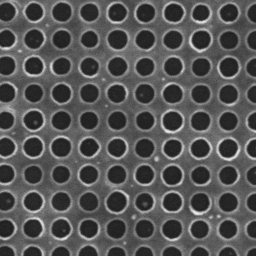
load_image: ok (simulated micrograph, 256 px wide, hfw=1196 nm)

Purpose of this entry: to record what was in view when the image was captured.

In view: a regular array of holes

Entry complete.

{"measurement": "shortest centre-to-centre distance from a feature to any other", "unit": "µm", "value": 0.126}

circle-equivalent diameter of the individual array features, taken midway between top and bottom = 0.0892 microns